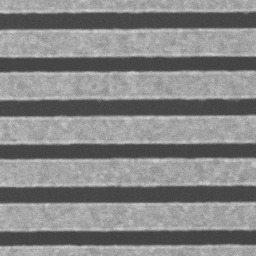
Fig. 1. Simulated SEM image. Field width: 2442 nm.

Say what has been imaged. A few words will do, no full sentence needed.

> lines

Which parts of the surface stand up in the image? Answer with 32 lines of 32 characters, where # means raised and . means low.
################################
################################
................................
................................
################################
################################
################################
................................
................................
################################
################################
################################
#.##............................
................................
................................
################################
################################
################################
................................
................................
################################
################################
################################
................................
................................
.###############################
################################
################################
################################
................................
................................
################################